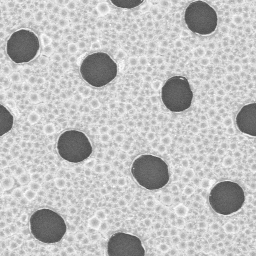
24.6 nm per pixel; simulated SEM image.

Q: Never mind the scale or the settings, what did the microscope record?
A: holes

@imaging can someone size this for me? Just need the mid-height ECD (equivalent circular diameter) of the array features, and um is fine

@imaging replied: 0.865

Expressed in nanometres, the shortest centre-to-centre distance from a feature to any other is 1980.